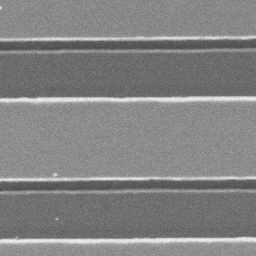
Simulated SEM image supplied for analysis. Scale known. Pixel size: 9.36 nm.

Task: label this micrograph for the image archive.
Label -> lines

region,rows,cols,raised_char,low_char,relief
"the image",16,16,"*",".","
****************
****************
................
................
................
................
****************
****************
****************
****************
****************
................
................
................
................
****************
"